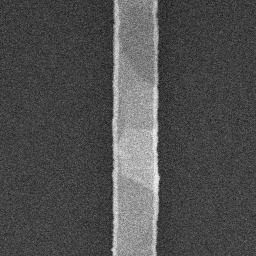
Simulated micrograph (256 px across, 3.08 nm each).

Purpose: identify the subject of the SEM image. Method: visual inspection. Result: one or a few lines or trenches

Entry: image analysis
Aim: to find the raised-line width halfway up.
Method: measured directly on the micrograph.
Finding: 0.122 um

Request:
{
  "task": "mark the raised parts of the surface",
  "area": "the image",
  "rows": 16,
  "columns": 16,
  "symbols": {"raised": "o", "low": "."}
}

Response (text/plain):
.......ooo......
.......ooo......
.......ooo......
.......ooo......
.......ooo......
.......ooo......
.......ooo......
.......ooo......
.......ooo......
.......ooo......
.......ooo......
.......ooo......
.......ooo......
.......ooo......
.......ooo......
.......ooo......